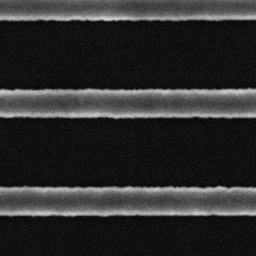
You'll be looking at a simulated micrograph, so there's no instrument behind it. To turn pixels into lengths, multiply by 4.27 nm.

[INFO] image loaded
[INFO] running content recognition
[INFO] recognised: lines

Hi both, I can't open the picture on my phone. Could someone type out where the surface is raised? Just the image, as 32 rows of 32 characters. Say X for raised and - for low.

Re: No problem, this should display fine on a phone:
XXXXXXXXXXXXXXXXXXXXXXXXXXXXXXXX
XXXXXXXXXXXXXXXXXXXXXXXXXXXXXXXX
--------X--X-XX-X-X-XXX---X-----
--------------------------------
--------------------------------
--------------------------------
--------------------------------
--------------------------------
--------------------------------
--------------------------------
--------------------------------
XXXXXXXXXXXXXXXXXXXXXXXXXXXXXXXX
XXXXXXXXXXXXXXXXXXXXXXXXXXXXXXXX
XXXXXXXXXXXXXXXXXXXXXXXXXXXXXXXX
XXXXXXXXXXXXXXXXXXXXXXXXXXXXXXXX
--------------------------------
--------------------------------
--------------------------------
--------------------------------
--------------------------------
--------------------------------
--------------------------------
--------------------------------
XXXXXXXXXX-XXXXXXXXX-XXXX-XXXXX-
XXXXXXXXXXXXXXXXXXXXXXXXXXXXXXXX
XXXXXXXXXXXXXXXXXXXXXXXXXXXXXXXX
XXXXXXXXXXXXXXXXXXXXXXXXXXXXXXXX
--------------------------------
--------------------------------
--------------------------------
--------------------------------
--------------------------------